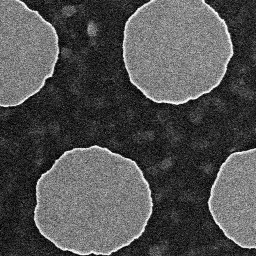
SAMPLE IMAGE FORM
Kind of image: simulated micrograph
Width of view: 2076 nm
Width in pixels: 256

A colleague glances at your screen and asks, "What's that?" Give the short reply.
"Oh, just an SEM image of raised bodies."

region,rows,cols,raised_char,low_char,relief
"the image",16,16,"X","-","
XX-------XXXX---
XXX-----XXXXXX--
XXXX----XXXXXX--
XXXX----XXXXXX--
XXX-----XXXXXX--
XX-------XXXX---
X---------------
----------------
----------------
----XXX--------X
---XXXXXX-----XX
--XXXXXXX----XXX
--XXXXXXX----XXX
--XXXXXXX----XXX
---XXXXXX-----XX
----XXXX--------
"